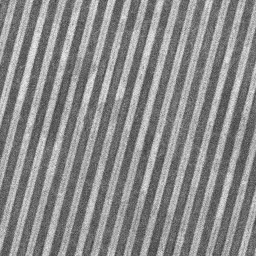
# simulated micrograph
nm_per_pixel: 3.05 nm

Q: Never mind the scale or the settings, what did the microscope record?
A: parallel lines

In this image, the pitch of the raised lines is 48.4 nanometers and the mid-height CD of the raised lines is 14.4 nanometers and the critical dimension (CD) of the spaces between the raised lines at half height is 32.1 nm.